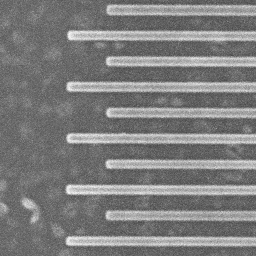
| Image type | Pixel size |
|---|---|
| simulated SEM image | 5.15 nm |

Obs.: parallel lines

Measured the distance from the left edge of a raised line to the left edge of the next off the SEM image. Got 132 nanometers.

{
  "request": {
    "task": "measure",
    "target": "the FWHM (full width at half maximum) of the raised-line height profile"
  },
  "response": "39.9 nm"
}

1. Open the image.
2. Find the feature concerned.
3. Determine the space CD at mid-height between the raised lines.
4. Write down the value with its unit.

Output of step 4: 90.1 nm